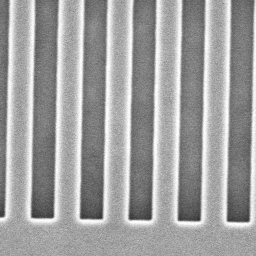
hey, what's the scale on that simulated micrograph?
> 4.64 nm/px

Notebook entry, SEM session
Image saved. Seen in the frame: groups of lines, slits or small figures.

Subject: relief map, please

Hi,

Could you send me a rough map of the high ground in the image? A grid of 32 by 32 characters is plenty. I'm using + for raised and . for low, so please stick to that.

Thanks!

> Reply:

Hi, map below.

.+++...+++....+++...+++...+++...
.+++...+++...+++....+++...+++...
.+++...+++...+++....+++...+++...
.+++...+++...+++....+++...+++...
.+++...+++...+++....+++...+++...
.+++...+++...+++....+++...+++...
.+++...+++...+++....++....+++...
.+++...+++...+++....++....+++...
.+++...+++...+++....++....+++...
.+++...+++...+++....++....+++...
.+++...+++...+++...+++....+++...
.+++...+++...+++...+++....+++...
.+++...+++...+++...+++....++....
.+++...+++...+++...+++....++....
.+++...+++...+++...+++....++....
.+++...+++...+++...+++...+++....
.+++...+++...+++...+++...+++....
.+++...+++...+++...+++...+++....
.+++...+++...+++...+++...+++...+
.+++...+++...+++...+++...+++...+
.+++...+++...+++...+++...+++...+
.+++...+++...+++...+++...+++...+
.+++...+++...+++...+++...+++...+
.+++...+++...+++...+++...+++...+
.+++...+++...+++...+++...+++...+
.+++...+++...+++...+++...+++...+
.+++...+++...+++...+++...+++...+
++++++++++..++++...+++...+++...+
++++++++++++++++++++++++++++++++
++++++++++++++++++++++++++++++++
++++++++++++++++++++++++++++++++
++++++++++++++++++++++++++++++++